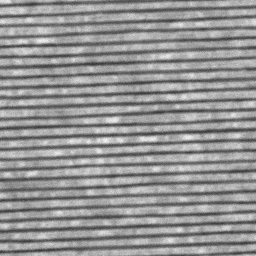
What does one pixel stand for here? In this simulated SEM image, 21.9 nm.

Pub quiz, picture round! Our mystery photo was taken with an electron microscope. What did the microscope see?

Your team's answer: parallel lines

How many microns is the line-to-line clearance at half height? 0.101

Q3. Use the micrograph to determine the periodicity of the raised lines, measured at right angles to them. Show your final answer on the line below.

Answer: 0.224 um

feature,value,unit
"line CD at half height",123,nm